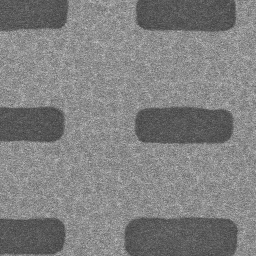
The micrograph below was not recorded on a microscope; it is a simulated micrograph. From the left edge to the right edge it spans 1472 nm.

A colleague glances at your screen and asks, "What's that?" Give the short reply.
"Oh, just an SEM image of holes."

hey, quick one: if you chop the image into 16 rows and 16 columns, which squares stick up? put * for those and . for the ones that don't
....*****......*
....*****......*
****************
****************
****************
****************
****************
....****.......*
....*****.....**
****************
****************
****************
****************
****************
....****.......*
....****.......*